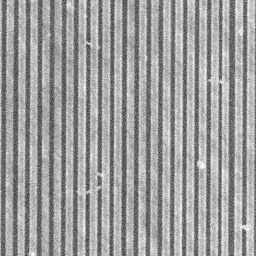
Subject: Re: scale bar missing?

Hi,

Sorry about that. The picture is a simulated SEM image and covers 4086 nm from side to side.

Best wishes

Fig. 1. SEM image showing parallel lines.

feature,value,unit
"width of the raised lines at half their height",102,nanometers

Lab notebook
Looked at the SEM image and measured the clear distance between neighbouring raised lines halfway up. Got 0.0878 micrometres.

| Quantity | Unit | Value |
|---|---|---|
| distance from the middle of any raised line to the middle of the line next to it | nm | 192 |